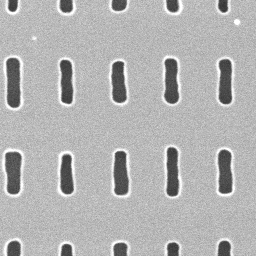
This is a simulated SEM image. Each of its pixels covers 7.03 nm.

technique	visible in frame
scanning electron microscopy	a regular array of holes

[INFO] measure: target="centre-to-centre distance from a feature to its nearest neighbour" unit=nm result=370